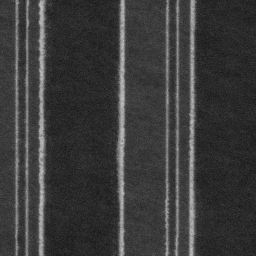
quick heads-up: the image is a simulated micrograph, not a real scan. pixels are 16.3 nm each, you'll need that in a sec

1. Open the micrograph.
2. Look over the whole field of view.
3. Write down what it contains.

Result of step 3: lines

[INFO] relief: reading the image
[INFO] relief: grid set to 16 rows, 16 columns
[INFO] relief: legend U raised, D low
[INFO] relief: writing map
UUUDDDDDUUUUDDDD
UUUDDDDDUUUUDDDD
UUUDDDDDUUUUDDDD
UUUDDDDDUUUUDDDD
UUUDDDDDUUUUDDDD
UUUDDDDDUUUUDDDD
UUUDDDDDUUUUDDDD
UUUDDDDDUUUUDDDD
UUUDDDDDUUUUDDDD
UUUDDDDDUUUUDDDD
UUUDDDDDUUUUDDDD
UUUDDDDDUUUUDDDD
UUUDDDDDUUUUDDDD
UUUDDDDDUUUUDDDD
UUUDDDDDUUUUDDDD
UUUDDDDDUUUUDDDD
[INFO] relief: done